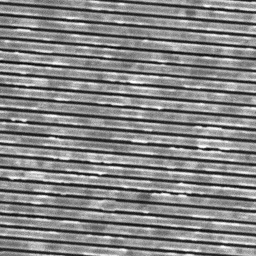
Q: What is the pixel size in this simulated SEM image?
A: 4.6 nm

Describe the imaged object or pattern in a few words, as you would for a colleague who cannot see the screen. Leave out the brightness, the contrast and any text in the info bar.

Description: parallel lines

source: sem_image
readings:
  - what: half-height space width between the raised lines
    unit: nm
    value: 17.2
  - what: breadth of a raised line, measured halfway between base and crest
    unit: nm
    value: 38.4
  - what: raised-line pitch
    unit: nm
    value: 53.7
